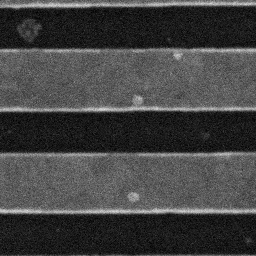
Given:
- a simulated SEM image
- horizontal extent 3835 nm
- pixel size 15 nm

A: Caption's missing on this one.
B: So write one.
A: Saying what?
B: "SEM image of lines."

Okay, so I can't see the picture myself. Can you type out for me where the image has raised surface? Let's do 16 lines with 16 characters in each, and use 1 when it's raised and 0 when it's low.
0000000000000000
0000000000000000
0000000000000000
1111111111111111
1111111111111111
1111111111111111
1111111111111111
0000000000000000
0000000000000000
0000000000000000
1111111111111111
1111111111111111
1111111111111111
0000000000000000
0000000000000000
0000000000000000